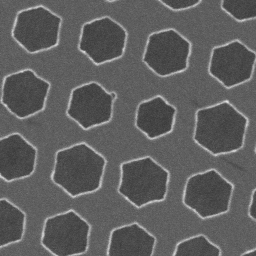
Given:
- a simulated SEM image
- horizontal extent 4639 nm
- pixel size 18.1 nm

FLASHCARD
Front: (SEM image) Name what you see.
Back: a regular array of holes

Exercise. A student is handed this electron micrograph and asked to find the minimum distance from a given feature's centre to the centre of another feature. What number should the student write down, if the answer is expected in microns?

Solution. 1.19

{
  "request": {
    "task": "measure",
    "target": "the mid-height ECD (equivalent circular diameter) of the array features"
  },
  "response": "813 nm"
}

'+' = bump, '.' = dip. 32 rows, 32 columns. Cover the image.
+++++++++++++++++++++...++++....
+++...+++++++++++++++++++++++...
++.....+++++..++++++++++++++++++
++.....+++.....+++++++++++++++++
++.....+++......+++....+++++++++
+++....+++......+++.....+++++.++
+++++++++++....+++......+++....+
++++++++++++..++++.....+++......
+++++++++++++++++++....+++......
+....++++++++++++++++++++++....+
......+++++.++++++++++++++++..++
......+++....+++++++++++++++++++
......+++.....+++++.++++++++++++
+....++++.....+++.....++++...+++
++.++++++.....+++.....+++.....++
++++++++++..+++++.....+++......+
++++++++++++++++++...+++.......+
...++++++++++++++++++++++.....++
....+++++..+++++++++++++++....++
....+++......+++++++++++++++++++
....+++......+++....++++++++++++
....+++......++......+++++.+++++
+++++++......++......+++....++++
++++++++....+++......++......+++
++++++++++++++++.....++......+++
.++++++++++++++++.+++++......++.
...++++++++++++++++++++++...+++.
...+++....++++++++++++++++++++++
...+++.....++++...++++++++++++++
...++......+++.....+++++++++++++
.++++......+++.....++++...++++++
+++++++...++++.....+++.....++++.